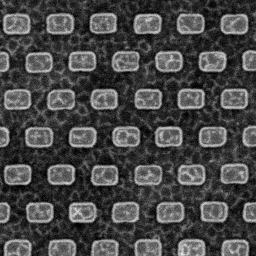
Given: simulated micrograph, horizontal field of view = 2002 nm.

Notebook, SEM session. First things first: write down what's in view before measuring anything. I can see a regular array of raised bodies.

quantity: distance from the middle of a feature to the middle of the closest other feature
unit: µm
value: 0.337